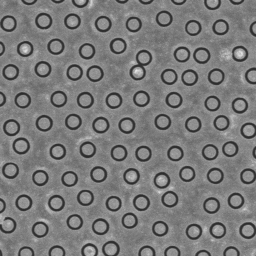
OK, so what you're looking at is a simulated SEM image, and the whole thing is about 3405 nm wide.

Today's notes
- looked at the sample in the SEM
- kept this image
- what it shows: a regular array of ring-shaped grooves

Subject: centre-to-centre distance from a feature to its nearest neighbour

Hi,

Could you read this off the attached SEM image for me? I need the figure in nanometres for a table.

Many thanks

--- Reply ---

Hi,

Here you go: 340